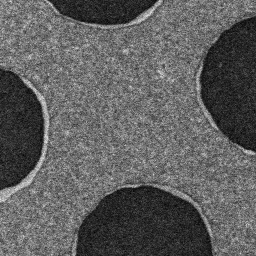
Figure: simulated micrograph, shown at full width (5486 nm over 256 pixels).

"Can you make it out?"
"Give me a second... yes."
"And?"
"holes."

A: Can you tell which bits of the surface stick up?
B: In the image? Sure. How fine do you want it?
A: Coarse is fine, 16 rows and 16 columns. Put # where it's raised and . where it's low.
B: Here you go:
###......#######
#####...#######.
#############...
#############...
.############...
..##########....
...##########...
...##########...
...###########..
...#############
..##############
.###############
######......####
#####........###
#####........###
#####........###